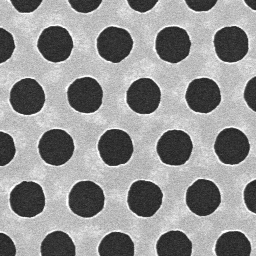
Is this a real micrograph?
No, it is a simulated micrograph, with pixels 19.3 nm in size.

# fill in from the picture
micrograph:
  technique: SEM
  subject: a regular array of holes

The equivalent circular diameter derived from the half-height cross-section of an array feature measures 0.703 µm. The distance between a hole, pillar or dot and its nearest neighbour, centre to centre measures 1120 nm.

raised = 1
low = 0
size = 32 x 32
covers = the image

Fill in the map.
10000111100001110000111000011110
11001111110111111011111111111111
11111111111111111111111111111111
11111100111110011111100111110011
00111000011100001111000011100001
00111000011100000110000011100001
00111000011100001111000011100001
01111100111110011111000111110011
11111111111111111111111111111111
11111111111111111111111111111111
11000111100011110000111100011110
10000111000001110000111000011100
10000011000001110000111000001110
11000111100011110000111100011110
11111111111111111111111111111111
11111111111111111111111111111111
11111100111110001111100111110011
00111000011100001111000011100001
00111000011100000111000011100001
00111000011110001111000011100001
01111100111110011111100111110011
11111111111111111111111111111111
11111111111111111111111110111111
11000111100001110000111100011110
10000011100001110000111000001100
10000011100001110000111000011110
11000111100011111000111100011111
11111111111111111111111111111111
11111111111111111111111111111111
01111100011110001111000111110001
00111000011100000111000011100001
00111000011100000111000011100001